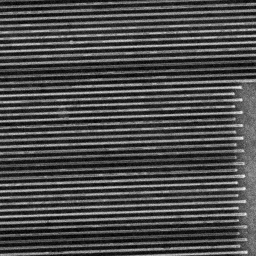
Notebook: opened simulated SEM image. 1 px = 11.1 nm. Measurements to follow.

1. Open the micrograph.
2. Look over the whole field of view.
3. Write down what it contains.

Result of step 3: parallel lines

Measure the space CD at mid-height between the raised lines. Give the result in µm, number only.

0.0513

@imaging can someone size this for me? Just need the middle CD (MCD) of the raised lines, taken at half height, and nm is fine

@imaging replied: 20.8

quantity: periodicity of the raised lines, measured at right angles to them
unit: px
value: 6.35